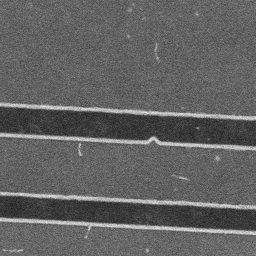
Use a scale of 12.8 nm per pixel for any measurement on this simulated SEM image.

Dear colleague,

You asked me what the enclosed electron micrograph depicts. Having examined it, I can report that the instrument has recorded one or a few lines or trenches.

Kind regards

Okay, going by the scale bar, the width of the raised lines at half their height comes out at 27.1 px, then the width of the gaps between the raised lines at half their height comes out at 747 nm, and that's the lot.